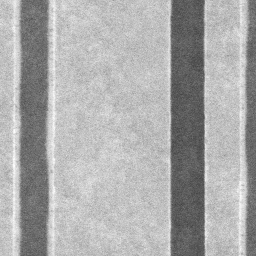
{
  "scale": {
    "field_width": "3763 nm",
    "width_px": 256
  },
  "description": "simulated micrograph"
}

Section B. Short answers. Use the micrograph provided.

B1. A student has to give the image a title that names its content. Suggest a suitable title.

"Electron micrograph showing lines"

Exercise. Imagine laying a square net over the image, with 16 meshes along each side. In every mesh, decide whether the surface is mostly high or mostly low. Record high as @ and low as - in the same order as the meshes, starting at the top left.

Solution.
@--@@@@@@@@--@@-
@--@@@@@@@@--@@-
@--@@@@@@@@--@@-
@--@@@@@@@@--@@-
@--@@@@@@@@--@@-
@--@@@@@@@@--@@-
@--@@@@@@@@--@@-
@--@@@@@@@@--@@-
@--@@@@@@@@--@@-
@--@@@@@@@@--@@-
@--@@@@@@@@--@@-
@--@@@@@@@@--@@-
@--@@@@@@@@--@@-
@--@@@@@@@@--@@-
@--@@@@@@@@--@@-
@--@@@@@@@@--@@-